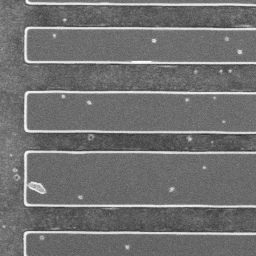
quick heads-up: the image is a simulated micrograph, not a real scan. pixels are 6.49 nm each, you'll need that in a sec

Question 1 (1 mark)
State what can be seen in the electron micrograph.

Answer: groups of lines, slits or small figures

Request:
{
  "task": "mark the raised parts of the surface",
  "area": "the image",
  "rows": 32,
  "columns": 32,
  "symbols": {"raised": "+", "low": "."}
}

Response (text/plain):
......++..++++++++++++++++++++++
................................
................................
....+...........................
...+++++++++++++++++++++++++++++
...+++++++++++++++++++++++++++++
...+++++++++++++++++++++++++++++
...+++++++++++++++++++++++++++++
................................
................................
................................
....+++++.......................
...+++++++++++++++++++++++++++++
...+++++++++++++++++++++++++++++
...+++++++++++++++++++++++++++++
...+++++++++++++++++++++++++++++
.................++..+++.+++++++
................................
................................
...+++++++++++++++++++++++++++++
...+++++++++++++++++++++++++++++
...+++++++++++++++++++++++++++++
...+++++++++++++++++++++++++++++
...+++++++++++++++++++++++++++++
...+++++++++++++++++++++++++++++
...+++++++++++++++++++++++++++++
................................
................................
................................
...+++++++++++++++++++++++++++++
...+++++++++++++++++++++++++++++
...+++++++++++++++++++++++++++++